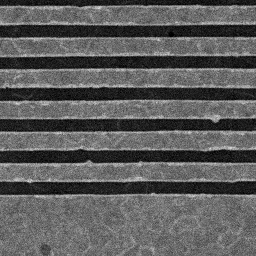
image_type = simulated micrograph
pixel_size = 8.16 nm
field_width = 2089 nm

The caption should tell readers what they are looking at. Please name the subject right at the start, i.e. parallel lines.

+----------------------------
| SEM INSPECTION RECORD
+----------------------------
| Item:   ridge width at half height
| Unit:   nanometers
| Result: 144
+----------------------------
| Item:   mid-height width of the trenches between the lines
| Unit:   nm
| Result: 114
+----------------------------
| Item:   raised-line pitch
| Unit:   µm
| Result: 0.256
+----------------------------